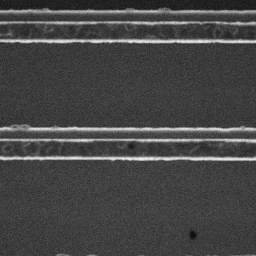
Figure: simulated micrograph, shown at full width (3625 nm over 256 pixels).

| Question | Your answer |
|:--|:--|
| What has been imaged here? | lines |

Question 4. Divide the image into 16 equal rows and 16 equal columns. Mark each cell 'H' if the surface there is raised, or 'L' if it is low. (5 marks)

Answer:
LLLLLLLLLLLLLLLL
HHHHHHHHHHHHHHHH
HHHHHHHHHHHHHHHH
LLLLLLLLLLLLLLLL
LLLLLLLLLLLLLLLL
LLLLLLLLLLLLLLLL
LLLLLLLLLLLLLLLL
LLLLLLLLLLLLLLLL
HHHHHHHHHHHHHHHH
HHHHHHHHHHHHHHHH
LLLLLLLLLLLLLLLL
LLLLLLLLLLLLLLLL
LLLLLLLLLLLLLLLL
LLLLLLLLLLLLLLLL
LLLLLLLLLLLLLLLL
LLLLLLLLLLLLLLLL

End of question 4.